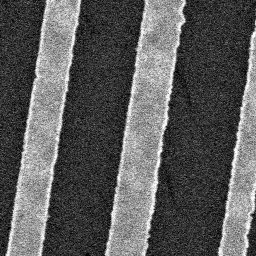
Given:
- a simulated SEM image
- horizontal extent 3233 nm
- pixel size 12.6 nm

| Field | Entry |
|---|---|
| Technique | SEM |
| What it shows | one or a few lines or trenches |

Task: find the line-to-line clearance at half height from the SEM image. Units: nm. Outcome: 836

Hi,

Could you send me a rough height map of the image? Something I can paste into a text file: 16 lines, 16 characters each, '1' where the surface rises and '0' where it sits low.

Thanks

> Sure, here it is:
0001100001100000
0001100001100000
0001100001100000
0011000001100000
0011000011100000
0011000011100001
0011000011000001
0011000011000001
0011000011000001
0111000011000001
0110000111000001
0110000111000011
0110000111000011
0110000110000011
0110000110000010
0110000110000010